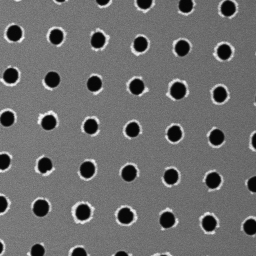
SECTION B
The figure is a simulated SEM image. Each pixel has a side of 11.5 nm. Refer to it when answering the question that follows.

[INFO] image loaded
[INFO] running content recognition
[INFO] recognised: a regular array of holes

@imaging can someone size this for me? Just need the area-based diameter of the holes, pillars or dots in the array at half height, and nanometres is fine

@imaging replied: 172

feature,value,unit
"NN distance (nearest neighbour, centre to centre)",483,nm